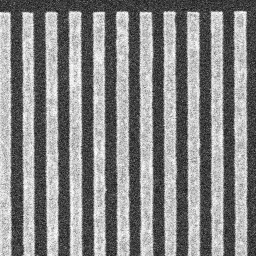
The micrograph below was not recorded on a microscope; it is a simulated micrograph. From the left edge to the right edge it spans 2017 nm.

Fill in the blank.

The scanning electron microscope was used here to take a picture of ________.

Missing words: parallel lines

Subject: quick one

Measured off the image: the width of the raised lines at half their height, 85.1 nm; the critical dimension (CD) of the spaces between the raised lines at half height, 0.1 micrometres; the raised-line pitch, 186 nanometres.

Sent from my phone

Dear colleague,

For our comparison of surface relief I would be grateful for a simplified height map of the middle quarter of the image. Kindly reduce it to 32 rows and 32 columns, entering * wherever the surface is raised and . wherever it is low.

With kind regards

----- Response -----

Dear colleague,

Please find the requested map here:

..**....**...***...***...***...*
...*....**...***...***...***...*
...*....**...***...***...***...*
...*....**...***...***...***...*
..**....**...***...***...***...*
..**....**...***...***...***...*
..**....**...***...***...***...*
..**....**...***...***...***...*
..**....**...***...***...***...*
..**....**...***...***...***...*
..**....**...***...***...***...*
..**....**...***...***...***...*
..**....**...***...***...***...*
..**....**...***...***...***...*
..**....**...***...***...***...*
..**....**...***...***...***...*
..**....**...***...***...***...*
..**....**...***...***...***...*
..**....**...***...***...***...*
..**....**...***...***...***...*
..**....**...***...***...***...*
..**....**...***...***...***...*
..**....**...***...***...***...*
..**....**...***...***...***...*
..**....**...***...***...***...*
..**....**...***...*.*...***...*
..**....**...***...***...***...*
..**....**...***...***...***...*
..**....**...***...***...***...*
..**....**...***...***...***...*
..**....**....**...***...***...*
..**....**....**...***...***...*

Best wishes